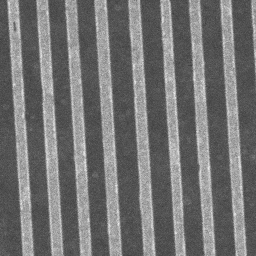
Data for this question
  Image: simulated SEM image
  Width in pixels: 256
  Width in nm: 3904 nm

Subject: parallel lines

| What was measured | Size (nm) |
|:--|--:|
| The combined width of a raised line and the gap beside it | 462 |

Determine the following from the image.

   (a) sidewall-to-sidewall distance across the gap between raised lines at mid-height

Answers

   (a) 308 nanometres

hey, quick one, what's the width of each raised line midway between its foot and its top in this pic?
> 0.154 microns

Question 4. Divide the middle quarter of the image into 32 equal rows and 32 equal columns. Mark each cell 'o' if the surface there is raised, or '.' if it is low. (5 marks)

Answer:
..oo.....oo......o.o.....oo.....
..oo.....oo......ooo.....oo.....
..oo.....oo......ooo.....oo.....
..oo.....oo.......oo.....oo.....
..oo.....ooo......oo.....ooo....
..oo.....ooo......oo.....ooo....
..oo.....ooo......oo......oo....
..oo.....ooo......oo......oo....
..oo.....ooo......oo......oo....
..oo.....ooo......oo......oo....
..ooo....ooo......oo......oo....
..ooo....ooo......oo......oo....
..ooo.....oo......oo......oo....
..ooo.....oo......oo......oo....
..ooo.....oo......ooo.....oo....
..ooo.....oo......ooo.....oo....
...oo.....oo......ooo.....oo....
...oo.....oo......ooo.....oo....
...oo.....oo......ooo.....oo....
...oo.....oo.......oo......o....
...oo.....ooo......oo.....ooo...
...oo.....ooo......oo......oo...
...oo.....ooo......oo......oo...
...oo.....ooo......oo......oo...
...oo.....ooo......oo......oo...
...oo.....ooo......oo......oo...
...oo.....ooo......oo......oo...
...ooo....ooo......oo......oo...
...ooo....ooo......oo......oo...
...ooo.....oo......oo......oo...
...ooo.....oo......ooo.....oo...
...ooo.....oo......ooo.....oo...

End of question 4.